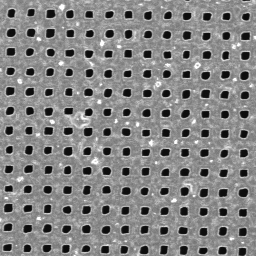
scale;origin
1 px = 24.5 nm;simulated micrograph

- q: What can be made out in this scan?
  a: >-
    a regular array of holes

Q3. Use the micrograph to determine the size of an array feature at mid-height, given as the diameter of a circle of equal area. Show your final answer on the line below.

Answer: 210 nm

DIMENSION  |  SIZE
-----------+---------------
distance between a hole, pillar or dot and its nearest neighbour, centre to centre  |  466 nm